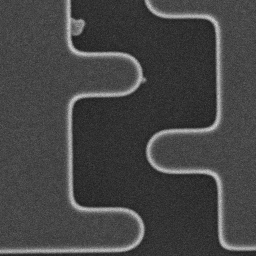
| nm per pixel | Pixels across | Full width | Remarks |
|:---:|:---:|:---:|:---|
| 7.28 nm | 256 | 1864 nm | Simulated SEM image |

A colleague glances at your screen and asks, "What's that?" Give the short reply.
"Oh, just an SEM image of groups of lines, slits or small figures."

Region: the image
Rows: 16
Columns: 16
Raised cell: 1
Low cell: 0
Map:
1111000001111111
1111000000000111
1111000000000011
1111111100000011
1111111110000011
1111111100000011
1111100000000011
1111000000000011
1111000000111111
1111000001111111
1111000000111111
1111000000000011
1111100000000011
1111111110000011
1111111110000011
1111111100000011